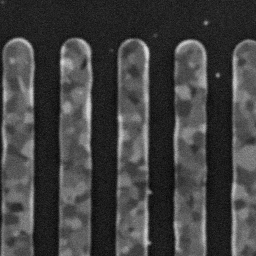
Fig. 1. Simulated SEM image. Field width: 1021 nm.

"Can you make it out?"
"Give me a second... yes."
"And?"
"groups of lines, slits or small figures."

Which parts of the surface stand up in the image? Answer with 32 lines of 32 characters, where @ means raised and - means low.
--------------------------------
--------------------------------
--------------------------------
--------------------------------
--------------------------------
-@@@----@@@----@@@-----@@-----@@
@@@@----@@@----@@@----@@@----@@@
@@@@----@@@----@@@----@@@@---@@@
-@@@----@@@----@@@----@@@@---@@@
@@@@----@@@----@@@----@@@@---@@@
@@@@----@@@----@@@----@@@@---@@@
-@@@----@@@----@@@----@@@@---@@@
-@@@----@@@----@@@----@@@@---@@@
-@@@----@@@----@@@----@@@@---@@@
@@@@----@@@----@@@----@@@@---@@@
@@@@----@@@----@@@----@@@@---@@@
@@@@----@@@----@@@----@@@@---@@@
@@@@----@@@----@@@----@@@@---@@@
-@@@----@@@----@@@----@@@@---@@@
@@@@----@@@----@@@----@@@@---@@@
@@@@----@@@----@@@----@@@@---@@@
@@@@----@@@----@@@----@@@@---@@@
@@@@----@@@----@@@----@@@@---@@@
@@@@----@@@----@@@----@@@@---@@@
@@@@----@@@----@@@----@@@@---@@@
@@@@----@@@----@@@----@@@@---@@@
@@@@----@@@----@@@----@@@----@@@
@@@@----@@@----@@@----@@@----@@@
@@@@---@@@@----@@@----@@@----@@@
@@@@----@@@----@@@----@@@----@@@
@@@@----@@@----@@@----@@@@---@@@
@@@@----@@@----@@@----@@@@---@@@